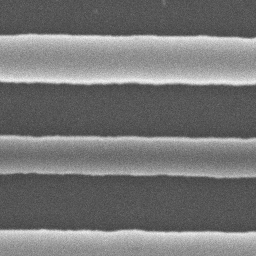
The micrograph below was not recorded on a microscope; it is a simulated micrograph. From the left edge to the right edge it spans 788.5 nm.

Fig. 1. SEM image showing lines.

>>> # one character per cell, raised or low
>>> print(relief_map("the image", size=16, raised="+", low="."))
................
................
++++++++++++++++
++++++++++++++++
++++++++++++++++
................
................
................
+...............
++++++++++++++++
++++++++++++++++
................
................
................
++++++++++..+...
++++++++++++++++